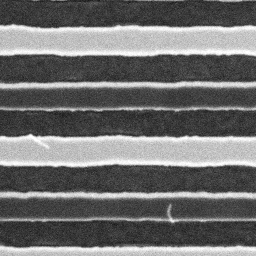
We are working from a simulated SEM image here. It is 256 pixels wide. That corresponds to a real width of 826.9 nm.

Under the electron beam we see lines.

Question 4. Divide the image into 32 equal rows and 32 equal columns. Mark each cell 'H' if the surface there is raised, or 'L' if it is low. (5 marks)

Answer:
LLLLLLLLLLLLLLLLLLLLLLLLLLLLLLLL
LLLLLLLLLLLLLLLLLLLLLLLLLLLLLLLL
LLLLLLLLLLLLLLLLLLLLLLLLLLLLLLLL
HHHHLLLHHHHHHHHHHHHHHHHHHHHHHHHH
HHHHHHHHHHHHHHHHHHHHHHHHHHHHHHHH
HHHHHHHHHHHHHHHHHHHHHHHHHHHHHHHH
HHHHHHHHHHHHHHHHHHHHHHHHHHHHHHHH
LLLLLLLLLLLLLLLLLLLLLLLLLLLLLLLL
LLLLLLLLLLLLLLLLLLLLLLLLLLLLLLLL
LLLLLLLLLLLLLLLLLLLLLLLLLLLLLLLL
LLLLLLLLLLHLHHLLHHHLLLHHHHHLLHLH
HHHHHHHHHHHHHHHHHHHHHHHHHHHHHHHH
HHHHHHHHHHHHHHHHHHHHHHHHHHHHHHHH
HHHHHHHHHHHHHHHHHHHHHHHHHHHHHHHH
LLLLLLLLLLLLLLLLLLLLLLLLLLLLLLLL
LLLLLLLLLLLLLLLLLLLLLLLLLLLLLLLL
LLLLLLLLLLLLLLLLLLLLLLLLLLLLLLLL
HHHHHHHHHHHHHHHHHHHHHHHHHHHHHHHH
HHHHHHHHHHHHHHHHHHHHHHHHHHHHHHHH
HHHHHHHHHHHHHHHHHHHHHHHHHHHHHHHH
HHHHHHHHHHHHHLLLLLLHHHHHHHHHHHHH
LLLLLLLLLLLLLLLLLLLLLLLLLLLLLLLL
LLLLLLLLLLLLLLLLLLLLLLLLLLLLLLLL
LLLLLLLLLLLLLLLLLLLLLLLLLLLLLLLL
HHHHHHHHHHHHHHHHHHHHHHHHHHHHHHHH
HHHHHHHHHHHHHHHHHHHHHHHHHHHHHHHH
HHHHHHHHHHHHHHHHHHHHHHHHHHHHHHHH
HHHHHHHHHHHHLLLHHHHHHHHHHHHHHHHH
LLLLLLLLLLLLLLLLLLLLLLLLLLLLLLLL
LLLLLLLLLLLLLLLLLLLLLLLLLLLLLLLL
LLLLLLLLLLLLLLLLLLLLLLLLLLLLLLLL
HHHHHHHHHHHHHHHHHHHHHHHHHHHHHHHH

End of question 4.